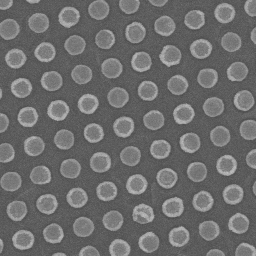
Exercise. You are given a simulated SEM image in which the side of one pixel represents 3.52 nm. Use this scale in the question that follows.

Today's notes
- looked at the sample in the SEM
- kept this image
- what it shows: a regular array of raised bodies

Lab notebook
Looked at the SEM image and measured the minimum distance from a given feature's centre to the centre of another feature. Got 0.104 micrometres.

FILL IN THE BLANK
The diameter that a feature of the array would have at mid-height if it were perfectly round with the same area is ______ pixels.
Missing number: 19.7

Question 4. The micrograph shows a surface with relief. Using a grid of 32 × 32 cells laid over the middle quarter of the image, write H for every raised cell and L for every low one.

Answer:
LLLLHLLLLLHHHHLLLHHHHHLLLLHLLLLL
LLHHHHHLLLHHHHLLLLHHHLLLLLLLLLLL
LLHHHHHLLLHHHHLLLLLLLLLLLLLLLLLL
LLHHHHHLLLLLLLLLLLLLLLLLLLLHHHLL
LLLHHHLLLLLLLLLLLLLLHHLLLLHHHHHL
LLLLLLLLLLLLLLLLLLLHHHHLLLHHHHHL
LLLLLLLLLLLLHHHLLLLHHHHLLLHHHHLL
LLLLLLLLLLLHHHHHLLLHHHHLLLLLLLLL
LLLLHHHHLLLHHHHHLLLHHHHLLLLLLLLL
LLLLHHHHHLLHHHHLLLLLLLLLLLLLLLLL
HLLLHHHHHLLLHHLLLLLLLLLLLLLLLHHH
HLLLHHHHLLLLLLLLLLLLLLLLLLLLHHHH
HLLLLLLLLLLLLLLLLLLLLHHHLLLHHHHH
LLLLLLLLLLLLLLHHLLLLHHHHHLLLHHHH
LLLLLLLLLLLLLHHHHLLLHHHHHLLLHHHL
LLLLLLHHHLLLLHHHHLLLLHHHLLLLLLLL
LLLLLHHHHHLLLHHHHLLLLLLLLLLLLLLL
HHLLLHHHHHLLLHHHHLLLLLLLLLLLLLHH
HHLLLHHHHLLLLLLLLLLLLLLLLLLLLHHH
HHLLLLLHLLLLLLLLLLLLLLHHHHLLLHHH
HHLLLLLLLLLLLLLLLLLLLLHHHHLLLHHH
LLLLLLLLLLLLLLLHHHHLLLHHHHHLLLHH
LLLLLLLLHHLLLLHHHHHLLLHHHHLLLLLL
LLLLLLLHHHHLLLHHHHHLLLLHHLLLLLLL
HHHLLLLHHHHHLLLHHHLLLLLLLLLLLLLL
HHHHLLLHHHHHLLLLLLLLLLLLLLLLLLLH
HHHHLLLLHHLLLLLLLLLLLLLLHHHLLLLH
HHHHLLLLLLLLLLLLLLLLLLLHHHHHLLLH
LHHLLLLLLLLLLLLLHHHHLLLHHHHHLLLL
LLLLLLLLLLHLLLLLHHHHLLLLHHHHLLLL
LLLLLLLLLHHHHLLLHHHHHLLLLHHLLLLL
LLHHHLLLHHHHHLLLHHHHLLLLLLLLLLLL